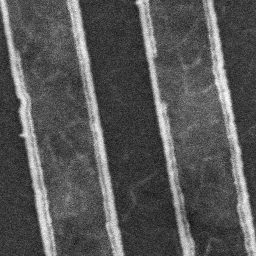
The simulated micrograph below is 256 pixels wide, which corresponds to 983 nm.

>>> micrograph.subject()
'one or a few lines or trenches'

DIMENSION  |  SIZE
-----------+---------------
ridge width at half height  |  271 nanometres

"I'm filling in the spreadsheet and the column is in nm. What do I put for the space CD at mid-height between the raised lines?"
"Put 238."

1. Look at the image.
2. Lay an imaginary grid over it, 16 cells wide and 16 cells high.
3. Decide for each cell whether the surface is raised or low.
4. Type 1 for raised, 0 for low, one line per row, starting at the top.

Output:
1111100001111000
1111100001111000
0111100001111100
0111100001111100
0111110000111100
0111110000111100
0111110000111100
0111110000111100
0011110000111110
0011110000111110
0011111000011110
0011111000011110
0011111000011110
0001111000011111
0001111000011111
0001111100001111